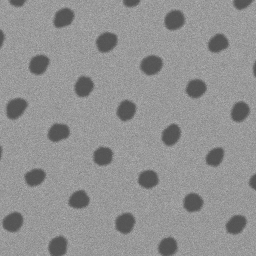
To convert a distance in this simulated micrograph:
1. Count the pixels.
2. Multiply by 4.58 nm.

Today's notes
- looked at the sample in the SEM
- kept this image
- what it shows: a regular array of holes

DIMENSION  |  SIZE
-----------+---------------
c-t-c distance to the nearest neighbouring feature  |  226 nanometers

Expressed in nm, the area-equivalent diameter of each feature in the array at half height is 90.7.